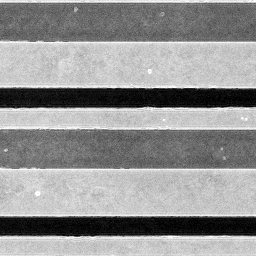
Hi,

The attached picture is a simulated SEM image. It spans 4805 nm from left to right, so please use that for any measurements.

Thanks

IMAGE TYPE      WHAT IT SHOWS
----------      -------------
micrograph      lines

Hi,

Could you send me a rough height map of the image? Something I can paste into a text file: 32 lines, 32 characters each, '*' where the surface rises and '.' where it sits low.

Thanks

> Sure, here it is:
................................
................................
................................
................................
................................
********************************
********************************
********************************
********************************
********************************
********************************
................................
................................
................................
********************************
********************************
................................
................................
................................
................................
................................
********************************
********************************
********************************
********************************
********************************
********************************
................................
................................
................................
********************************
********************************